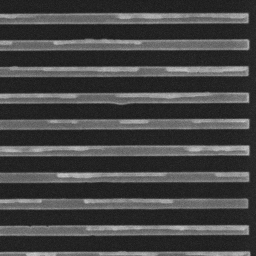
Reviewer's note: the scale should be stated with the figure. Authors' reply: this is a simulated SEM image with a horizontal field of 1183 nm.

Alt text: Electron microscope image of parallel lines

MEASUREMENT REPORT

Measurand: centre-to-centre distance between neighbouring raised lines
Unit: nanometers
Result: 122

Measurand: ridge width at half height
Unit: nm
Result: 43.4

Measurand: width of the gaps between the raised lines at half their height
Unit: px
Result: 17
